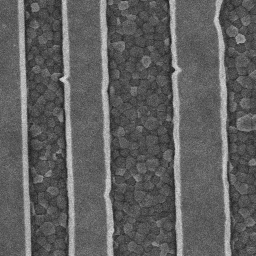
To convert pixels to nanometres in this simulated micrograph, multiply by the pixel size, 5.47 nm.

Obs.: one or a few lines or trenches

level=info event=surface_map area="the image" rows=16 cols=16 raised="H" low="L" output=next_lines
HLLLHHLLLLLHHHLL
HLLLHHLLLLLHHHLL
HLLLHHHLLLLHHHLL
HLLLHHHLLLLHHHLL
HLLLHHHLLLLHHHLL
HLLLHHHLLLLHHHLL
HLLLHHHLLLLHHHLL
HLLLHHHLLLLHHHLL
HHLLHHHLLLLHHHLL
HHLLHHHLLLLHHHLL
HHLLHHHLLLLHHHLL
HHLLHHHLLLLHHHLL
HHLLHHHLLLLHHHLL
HHLLHHHLLLLHHHLL
HHLLHHHLLLLHHHLL
HHLLHHHLLLLHHHLL